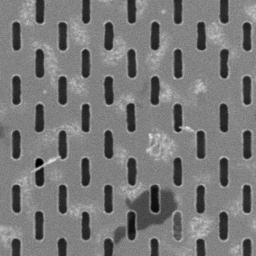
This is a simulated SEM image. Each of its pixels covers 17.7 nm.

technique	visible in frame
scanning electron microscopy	a regular array of holes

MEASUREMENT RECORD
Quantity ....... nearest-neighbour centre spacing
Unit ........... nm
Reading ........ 620